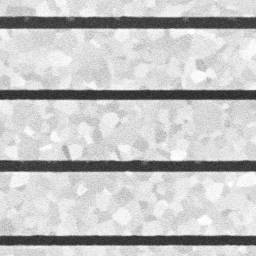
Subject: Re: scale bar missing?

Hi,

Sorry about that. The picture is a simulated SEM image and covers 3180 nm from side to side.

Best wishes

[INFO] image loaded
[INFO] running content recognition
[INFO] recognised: lines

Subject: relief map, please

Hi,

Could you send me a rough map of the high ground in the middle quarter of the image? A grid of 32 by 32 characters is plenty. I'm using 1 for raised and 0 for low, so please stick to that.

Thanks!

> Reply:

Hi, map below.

11111111111111111111111111111111
11111111111111111111111111111111
11111111111111111111111111111111
11111111111111111111111111111111
11111111111111111111111111111111
11111111111111111111111111111111
00000000000000000000000000000000
00000000000000000000000000000000
00000000000000000000000000000000
11111111111111111111111111111111
11111111111111111111111111111111
11111111111111111111111111111111
11111111111111111111111111111111
11111111111111111111111111111111
11111111111111111111111111111111
11111111111111111111111111111111
11111111111111111111111111111111
11111111111111111111111111111111
11111111111111111111111111111111
11111111111111111111111111111111
11111111111111111111111111111111
11111111111111111111111111111111
11111111111111111111111111111111
11111111111111111111111111111111
00000000000000000000000000000000
00000000000000000000000000000000
00000000000000000000000000000000
11111111111111111111111111111111
11111111111111111111111111111111
11111111111111111111111111111111
11111111111111111111111111111111
11111111111111111111111111111111